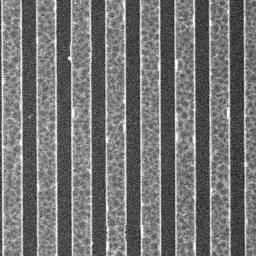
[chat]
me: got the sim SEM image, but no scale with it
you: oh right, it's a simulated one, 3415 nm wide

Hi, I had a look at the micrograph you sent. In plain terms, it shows parallel lines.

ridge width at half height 0.253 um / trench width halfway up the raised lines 200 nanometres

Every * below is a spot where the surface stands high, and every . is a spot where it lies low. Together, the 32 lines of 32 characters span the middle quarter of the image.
..*****....****.....****....****
..*****....****....*****....****
..*****....****....*****....****
..*****....****....*****....**.*
..*****....****....*****....****
..*****....****....*****....****
..*****....****....*****....****
..*****....****....*****....****
..*****....****....*****....****
..*****....***.....*****....***.
..*****....****....*****....*.*.
..*****....****....*****....*...
..*****....****....*****.....***
..*****....****....*****.....**.
..*****....****....*****....**.*
..*****....****....*****....****
..*****....****....*****....****
..*****....****....*****....****
..*****.....***....*****....****
..*****.....***....*****....****
..*****....****....*****....****
..*****....**......*****....****
..*****....****....*****....****
..***.*....****....*****....****
..*****....****....*****....****
..*****....****....*****....****
..****.....****....*****....****
..*****....****....*****....****
..*****....****....*****....****
..*****....****....*****....****
..*****....****....*****....****
..*****....*.**....*****....****